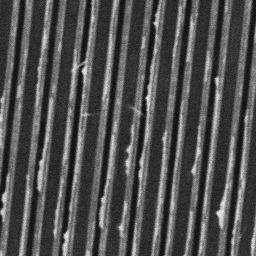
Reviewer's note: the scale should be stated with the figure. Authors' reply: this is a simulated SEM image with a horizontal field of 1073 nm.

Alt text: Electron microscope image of parallel lines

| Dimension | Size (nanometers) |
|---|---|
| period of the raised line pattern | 69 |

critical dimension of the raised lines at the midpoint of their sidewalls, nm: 27.6